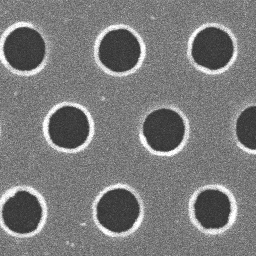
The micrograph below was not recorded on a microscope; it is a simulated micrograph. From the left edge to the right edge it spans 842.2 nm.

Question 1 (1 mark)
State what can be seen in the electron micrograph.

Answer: a regular array of holes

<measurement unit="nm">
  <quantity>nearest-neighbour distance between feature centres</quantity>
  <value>302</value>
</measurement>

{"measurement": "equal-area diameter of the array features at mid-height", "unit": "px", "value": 42.7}